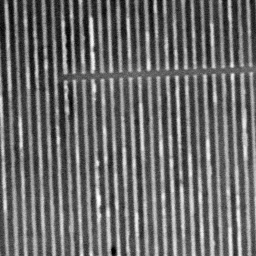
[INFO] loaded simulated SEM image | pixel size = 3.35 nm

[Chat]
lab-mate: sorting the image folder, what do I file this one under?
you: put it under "parallel lines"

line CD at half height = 10.9 nm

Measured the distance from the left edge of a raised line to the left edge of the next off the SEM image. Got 31.2 nm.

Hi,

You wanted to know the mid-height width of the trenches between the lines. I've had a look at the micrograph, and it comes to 0.0213 microns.